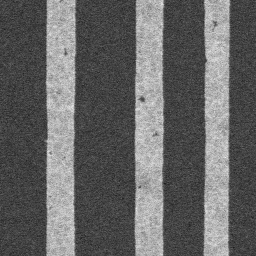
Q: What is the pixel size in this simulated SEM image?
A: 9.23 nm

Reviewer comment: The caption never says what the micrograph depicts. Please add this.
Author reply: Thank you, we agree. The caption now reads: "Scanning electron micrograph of one or a few lines or trenches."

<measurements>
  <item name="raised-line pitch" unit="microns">0.721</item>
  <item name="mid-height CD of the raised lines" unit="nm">216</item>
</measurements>